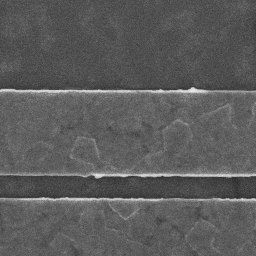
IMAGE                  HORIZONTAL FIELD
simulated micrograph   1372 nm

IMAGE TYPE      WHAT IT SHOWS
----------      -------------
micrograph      one or a few lines or trenches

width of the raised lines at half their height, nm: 385